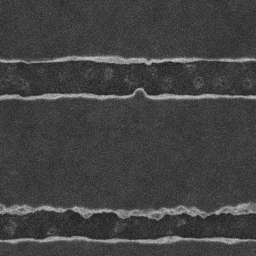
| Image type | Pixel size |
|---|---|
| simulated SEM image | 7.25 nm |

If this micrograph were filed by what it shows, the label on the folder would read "one or a few lines or trenches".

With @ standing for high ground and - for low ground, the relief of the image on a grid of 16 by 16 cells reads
@@@@@@@@@@@@@@@@
@@@@@@@@@@@@@@@@
@@@@@@@@@@@@@@@@
@@@@@@@@@@@@@@@@
----------------
----------------
@@@@@@@@@@@@@@@@
@@@@@@@@@@@@@@@@
@@@@@@@@@@@@@@@@
@@@@@@@@@@@@@@@@
@@@@@@@@@@@@@@@@
@@@@@@@@@@@@@@@@
@@@@@@@@@@@@@@@@
----------------
----------------
@@@@@@@@@@@@@@@@